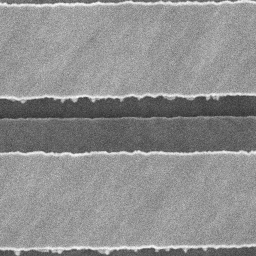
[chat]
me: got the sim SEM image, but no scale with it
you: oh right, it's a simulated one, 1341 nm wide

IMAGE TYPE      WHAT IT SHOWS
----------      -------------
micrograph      lines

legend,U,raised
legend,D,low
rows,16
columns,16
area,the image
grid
UUUUUUUUUUUUUUUU
UUUUUUUUUUUUUUUU
UUUUUUUUUUUUUUUU
UUUUUUUUUUUUUUUU
UUUUUUUUUUUUUUUU
UUUUUUUUUUUUUUUU
DDDDDDDDDDDDDDDD
DDDDDDDDDDDDDDDD
DDDDDDDDDDDDDDDD
DDUDDDUUUUUDUUUU
UUUUUUUUUUUUUUUU
UUUUUUUUUUUUUUUU
UUUUUUUUUUUUUUUU
UUUUUUUUUUUUUUUU
UUUUUUUUUUUUUUUU
UUUUUUUUUUUDDDDD